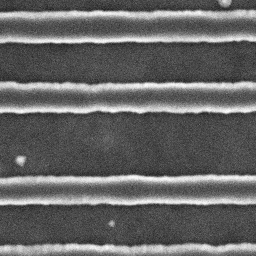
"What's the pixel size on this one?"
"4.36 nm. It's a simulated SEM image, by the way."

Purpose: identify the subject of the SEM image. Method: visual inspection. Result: lines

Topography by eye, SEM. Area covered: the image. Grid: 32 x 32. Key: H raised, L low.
LLLLLLLLLLLLLLLLLLLLLLLLLLLLLLLL
LLLLLLLLLLLLLLLLLLLLLLLLLLLLLLLL
HHHHHHHHHHHHHHHHHHHHHHHHHHHHHHHH
HHHHHHHHHHHHHHHHHHHHHHHHHHHHHHHH
HHHHHHHHHHHHHHHHHHHHHHHHHHHHHHHH
LLLLLLLLLLLLLLLLLLLLLLLLLLLLLLLL
LLLLLLLLLLLLLLLLLLLLLLLLLLLLLLLL
LLLLLLLLLLLLLLLLLLLLLLLLLLLLLLLL
LLLLLLLLLLLLLLLLLLLLLLLLLLLLLLLL
LLLLLLLLLLLLLLLLLLLLLLLLLLLLLLLL
HHLLLLLLLLLLLLLLLLLLLLLLLLLLLLHL
HHHHHHHHHHHHHHHHHHHHHHHHHHHHHHHH
HHHHHHHHHHHHHHHHHHHHHHHHHHHHHHHH
HHHHHHHHHHHHHHHHHHHHHHHHHHHHHHHH
LLLLLLLLLLLLLLLLLLLLLLLLLLLLLLLL
LLLLLLLLLLLLLLLLLLLLLLLLLLLLLLLL
LLLLLLLLLLLLLLLLLLLLLLLLLLLLLLLL
LLLLLLLLLLLLLLLLLLLLLLLLLLLLLLLL
LLLLLLLLLLLLLLLLLLLLLLLLLLLLLLLL
LLLLLLLLLLLLLLLLLLLLLLLLLLLLLLLL
LLLLLLLLLLLLLLLLLLLLLLLLLLLLLLLL
LLLLLLLLLLLLLLLLLLLLLLLLLLLLLLLL
LHHHHHHHHHHHHHHHHHHHHHHHHHHHHHHH
HHHHHHHHHHHHHHHHHHHHHHHHHHHHHHHH
HHHHHHHHHHHHHHHHHHHHHHHHHHHHHHHH
LLLLLLLLLLLLLLLLLLLLLLLLLLLLLLLL
LLLLLLLLLLLLLLLLLLLLLLLLLLLLLLLL
LLLLLLLLLLLLLLLLLLLLLLLLLLLLLLLL
LLLLLLLLLLLLLLLLLLLLLLLLLLLLLLLL
LLLLLLLLLLLLLLLLLLLLLLLLLLLLLLLL
LLLLLLLLLLLLLLLLLLLLLLLLLLLLLLLL
HHHHHHHHHHHHHHHHHHHHHHHHHHHHHHHH